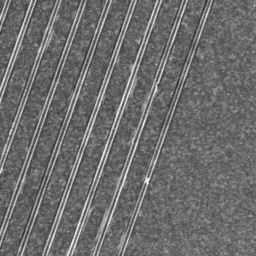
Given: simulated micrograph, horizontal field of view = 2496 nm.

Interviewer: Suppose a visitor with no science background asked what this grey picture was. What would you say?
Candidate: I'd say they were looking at parallel lines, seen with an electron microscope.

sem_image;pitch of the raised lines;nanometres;232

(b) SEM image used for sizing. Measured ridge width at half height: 42.5 nanometres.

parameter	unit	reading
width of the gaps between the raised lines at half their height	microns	0.19